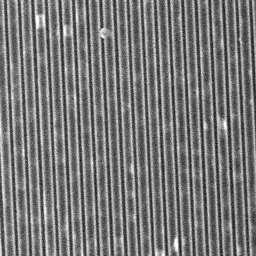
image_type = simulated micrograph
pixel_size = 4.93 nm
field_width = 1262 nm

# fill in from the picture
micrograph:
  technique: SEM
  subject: parallel lines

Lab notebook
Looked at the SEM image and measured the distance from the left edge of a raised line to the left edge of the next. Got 0.067 micrometres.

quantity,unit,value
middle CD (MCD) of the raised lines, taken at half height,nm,47.4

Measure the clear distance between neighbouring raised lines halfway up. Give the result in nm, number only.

18.5